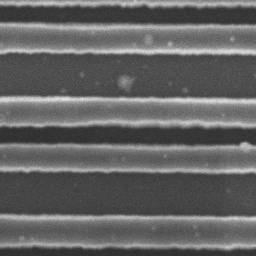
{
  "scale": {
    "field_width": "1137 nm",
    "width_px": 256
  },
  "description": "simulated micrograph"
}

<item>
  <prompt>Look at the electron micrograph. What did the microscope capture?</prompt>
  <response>lines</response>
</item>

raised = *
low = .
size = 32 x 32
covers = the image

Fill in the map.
********************************
................................
................................
********************************
********************************
********************************
*..*..**************************
................................
................................
................................
................................
................................
***************************.*...
********************************
********************************
********************************
................................
................................
********************************
********************************
********************************
.........................******.
................................
................................
................................
................................
................................
********************************
********************************
********************************
********************************
................................